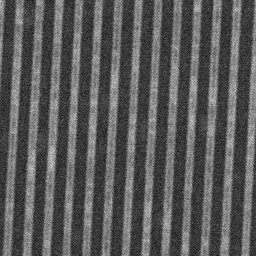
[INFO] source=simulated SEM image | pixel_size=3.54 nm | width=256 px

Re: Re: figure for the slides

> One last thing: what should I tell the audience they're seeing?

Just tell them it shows parallel lines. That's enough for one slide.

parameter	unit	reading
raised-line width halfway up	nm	23.4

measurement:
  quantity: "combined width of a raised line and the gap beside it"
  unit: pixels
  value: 19.8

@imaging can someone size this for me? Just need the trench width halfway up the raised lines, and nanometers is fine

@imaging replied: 47.3